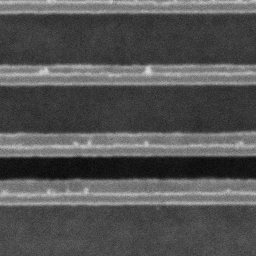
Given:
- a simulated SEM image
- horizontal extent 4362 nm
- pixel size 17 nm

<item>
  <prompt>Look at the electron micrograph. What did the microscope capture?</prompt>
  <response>lines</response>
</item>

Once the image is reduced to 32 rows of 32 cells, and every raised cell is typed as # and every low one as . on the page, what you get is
################################
###############.#.###...........
................................
................................
................................
................................
................................
................................
################################
################################
###################....#........
................................
................................
................................
................................
................................
................................
################################
################################
##############....#.............
................................
................................
................................
################################
################################
................................
................................
................................
................................
................................
................................
................................